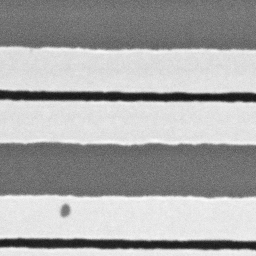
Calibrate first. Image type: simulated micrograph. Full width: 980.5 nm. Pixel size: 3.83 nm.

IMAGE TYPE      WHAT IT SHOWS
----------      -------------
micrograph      lines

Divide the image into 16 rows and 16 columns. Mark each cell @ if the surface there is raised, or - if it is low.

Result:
----------------
----------------
----------------
@@@@@@@@@@@@@@@@
@@@@@@@@@@@@@@@@
@@@@@@@@@@@@@@@@
@@@@@@@@@@@@@@@@
@@@@@@@@@@@@@@@@
@@@@@@@@@@@@@@@@
----------------
----------------
----------------
@@@@@@@@@@@@@@@@
@@@@@@@@@@@@@@@@
@@@@@@@@@@@@@@@@
@---------------